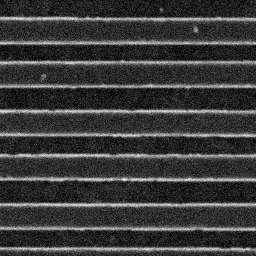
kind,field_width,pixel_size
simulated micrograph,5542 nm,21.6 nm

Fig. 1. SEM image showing lines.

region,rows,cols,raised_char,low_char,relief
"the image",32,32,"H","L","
LLLLLLLLLLLLLLLLLLLLLLLLLLLLLLLL
LLLLLLLLLLLLLLLLLLLLLLLLLLLLLLLL
HHHHHHHHHHHHHHHHHHHHHHHHHHHHHHHH
HHHHHHHHHHHHHHHHHHHHHHHHHHHHHHHH
HHHHHHHHHHHHHHHHHHHHHHHHHHHHHHHH
LLLLLLLLLLLLLLLLLLLLLLLLLLLLLLLL
LLLLLLLLLLLLLLLLLLLLLLLLLLLLLLLL
LLLLLLLLLLLLLLLLLLLLLLLLLLLLLLLL
HHHHHHHHHHHHHHHHHHHHHHHHHHHHHHHH
HHHHHHHHHHHHHHHHHHHHHHHHHHHHHHHH
HHHHHHHHHHHHHHHHHHHHHHHHHHHHHHHH
LLLLLLLLLLLLLLLLLLLLLLLLLLLLLLLL
LLLLLLLLLLLLLLLLLLLLLLLLLLLLLLLL
LLLLLLLLLLLLLLLLLLLLLLLLLLLLLLLL
HHHHHHHHHHHHHHHHHHHHHHHHHHHHHHHH
HHHHHHHHHHHHHHHHHHHHHHHHHHHHHHHH
HHHHHHHHHHHHHHHHHHHHHHHHHHHHHHHH
LLLLLLLLLLLLLLLLLLLLLLLLLLLLLLLL
LLLLLLLLLLLLLLLLLLLLLLLLLLLLLLLL
HHHHHHHHHHHHHHHHHHHHHHHHHHHHHHHH
HHHHHHHHHHHHHHHHHHHHHHHHHHHHHHHH
HHHHHHHHHHHHHHHHHHHHHHHHHHHHHHHH
LLLLLLLLLLLLLLLLLLLLHHHHHHHHHHHH
LLLLLLLLLLLLLLLLLLLLLLLLLLLLLLLL
LLLLLLLLLLLLLLLLLLLLLLLLLLLLLLLL
LLLLLLLLLLLLLLLLLLLLLLLLLLLLLLLL
HHHHHHHHHHHHHHHHHHHHHHHHHHHHHHHH
HHHHHHHHHHHHHHHHHHHHHHHHHHHHHHHH
HHHHHHHHHHHHHHHHHHHHHHHHHHHHHHHH
LLLLLLLLLLLLLLLLLLLLLLLLLLLLLLLL
LLLLLLLLLLLLLLLLLLLLLLLLLLLLLLLL
HHHHHHHHHHHHHHHHHHHHHHHHHHHHHHHH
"